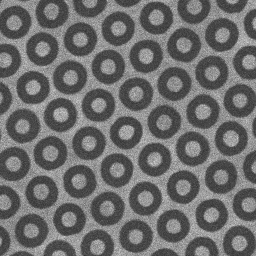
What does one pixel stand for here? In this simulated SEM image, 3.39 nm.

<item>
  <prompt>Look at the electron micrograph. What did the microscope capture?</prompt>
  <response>a regular array of ring-shaped grooves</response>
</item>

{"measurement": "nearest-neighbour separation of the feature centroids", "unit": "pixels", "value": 38.8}